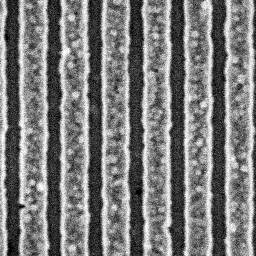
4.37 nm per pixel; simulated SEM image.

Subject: parallel lines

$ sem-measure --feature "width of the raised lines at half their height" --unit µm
0.108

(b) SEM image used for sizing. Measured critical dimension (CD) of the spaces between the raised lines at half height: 71 nanometers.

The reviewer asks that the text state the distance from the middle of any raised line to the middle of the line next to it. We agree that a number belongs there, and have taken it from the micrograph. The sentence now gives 180 nm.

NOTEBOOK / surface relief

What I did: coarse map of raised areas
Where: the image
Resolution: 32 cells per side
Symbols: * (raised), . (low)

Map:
*..***..***..***..***..***...**.
*..***..***..***..***..***...***
*..***..***..***..***..***..***.
...***..***..***..***..***..***.
...***..***..***..***..***..***.
*..***..***..***..***..***..***.
*..***..***..***..***..***...**.
*..***..***..***..***..***...**.
...***..***..***..***..***..***.
*..***..***..***..***..***..***.
*..***..***..***..***..***..***.
*..***..***..***..***..***..***.
*..***..***..***..***..***..***.
*..***..***..***..***..***..***.
*..***..***..***..***..***..***.
*..***..***..***..***..***..***.
*..***..***..***..***..***..***.
...***..***..***..***..***..****
...***..***..***..***..***..****
...***..***..***..***..***..***.
...***..***..***..***..***..***.
...***..***..***..***..***..***.
...***..***..***..***..***..****
...***..***..***..***..***..***.
...***..***..***..***..***..***.
*..***..***..***..***..***..***.
*..***..***..***..***..***..****
*..***..***..***..***..***..***.
*..***..***..***..***..***..***.
*..***..***..***..***..***..***.
*..***..***..***..***..***..***.
*..***..***..***..***..***..****